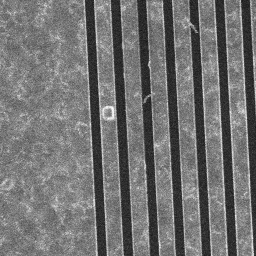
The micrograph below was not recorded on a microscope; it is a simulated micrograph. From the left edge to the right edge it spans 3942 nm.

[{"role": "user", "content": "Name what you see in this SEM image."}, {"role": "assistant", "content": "parallel lines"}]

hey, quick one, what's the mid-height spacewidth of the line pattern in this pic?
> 10.5 pixels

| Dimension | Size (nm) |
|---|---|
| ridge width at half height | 236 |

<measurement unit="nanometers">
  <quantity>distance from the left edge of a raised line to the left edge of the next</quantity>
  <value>400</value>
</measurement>